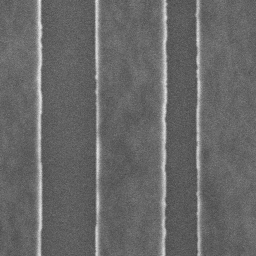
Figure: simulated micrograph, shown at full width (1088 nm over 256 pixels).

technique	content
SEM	lines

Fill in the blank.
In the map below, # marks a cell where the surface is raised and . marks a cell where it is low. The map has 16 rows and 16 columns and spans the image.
###...####..####
###...####..####
###...####..####
###...####..####
###...####..####
###...####..####
###...####..####
###...####..####
###...####..####
###...####..####
###...####..####
###...####..####
###...####..####
###...####..####
###...####..####
###...####..####